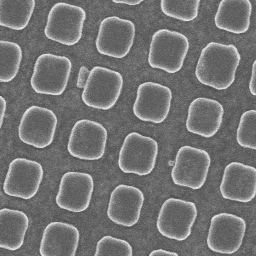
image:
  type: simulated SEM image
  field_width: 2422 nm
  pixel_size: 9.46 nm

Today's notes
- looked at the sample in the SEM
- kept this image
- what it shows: a regular array of raised bodies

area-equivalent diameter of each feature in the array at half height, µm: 0.371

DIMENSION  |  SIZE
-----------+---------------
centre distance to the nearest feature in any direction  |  0.492 microns